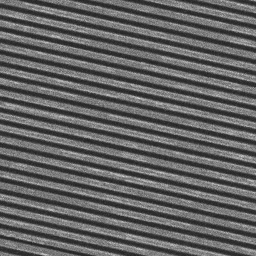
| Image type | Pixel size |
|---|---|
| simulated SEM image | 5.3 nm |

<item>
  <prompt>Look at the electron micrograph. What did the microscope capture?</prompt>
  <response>parallel lines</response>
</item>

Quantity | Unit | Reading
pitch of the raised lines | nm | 59.9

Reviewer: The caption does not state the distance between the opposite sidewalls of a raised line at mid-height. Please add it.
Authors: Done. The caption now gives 33 nanometers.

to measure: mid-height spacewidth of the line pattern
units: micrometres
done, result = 0.0278